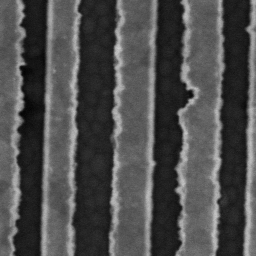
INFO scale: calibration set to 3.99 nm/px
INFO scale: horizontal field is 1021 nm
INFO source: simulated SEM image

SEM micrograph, one or a few lines or trenches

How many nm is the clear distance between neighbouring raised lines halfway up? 130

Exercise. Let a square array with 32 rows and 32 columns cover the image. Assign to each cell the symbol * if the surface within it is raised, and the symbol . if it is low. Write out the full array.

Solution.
***...****.....****....*****....
***...****.....****....*****....
***...****.....****....*****....
**....***......****....****....*
***...***......****....*****....
**....***......****....*****....
**....****.....****....*****....
**....****.....****....*****...*
**....***......****....*****...*
***...***......****....*****....
***...***......****....*****...*
***...***......****.....***....*
**....***......****.....***....*
**....***......****....****....*
**....***......****...*****....*
**....***......****....****....*
**....***......****....****....*
**....***.....*****....****....*
**....***.....*****....****....*
**....***.....*****....****....*
**....***......****....****....*
**....***.....*****...*****....*
**....***.....*****....****....*
**....***.....*****....****....*
**....***.....*****....****....*
**....***.....*****....****....*
**....***.....*****....****....*
**....***.....*****....****....*
**....***.....****.....****....*
**...****.....****.....****....*
*....****.....****.....****....*
**...****.....*****...*****....*